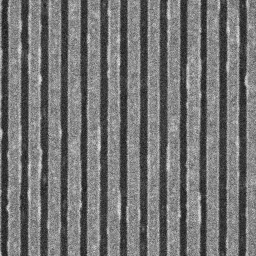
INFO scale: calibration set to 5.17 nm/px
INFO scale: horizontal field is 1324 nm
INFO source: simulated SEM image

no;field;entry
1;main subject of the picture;parallel lines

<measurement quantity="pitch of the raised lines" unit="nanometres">103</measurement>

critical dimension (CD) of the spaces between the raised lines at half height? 38.8 nm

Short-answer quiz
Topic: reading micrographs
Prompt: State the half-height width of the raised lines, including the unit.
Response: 0.0627 µm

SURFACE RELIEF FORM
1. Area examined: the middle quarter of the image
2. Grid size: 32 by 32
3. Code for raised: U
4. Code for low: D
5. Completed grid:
DUUUDDUUUDDUUUDDUUUDDUUUDDUUUDDU
DUUUDDUUUDDUUUDDUUUDDUUUDDUUUDDU
DUUUDDUUUDDUUUDDUUUDDUUUDDUUUDDU
DUUUDDUUUDDUUUDDUUUDDUUUDDUUUDDU
DUUUDDUUUDDUUUDDUUUDDUUUDDUUUDDU
DUUUDDUUUDDUUUDDUUUDDUUUDDUUUDDU
DUUUDDUUUDDUUUDDUUUDDUUUDDUUUDDU
DUUUDDUUUDDUUUDDUUUDDUUUDDUUUDDU
DUUUDDUUUDDUUUDDUUUDDUUUDDUUUDDU
DUUUDDUUUDDUUUDDUUUDDUUUDDUUUDDU
DUUUDDUUUDDUUUDDUUUDDUUUDDUUUDDU
DUUUDDUUUDDUUUDDUUUDDUUUDDUUUDDU
DUUUDDUUUDDUUUDDUUUDDUUUDDUUUDDU
DUUUDDUUUDDUUUDDUUUDDUUUDDUUUDDU
DUUUDDUUUDDUUUDDUUUDDUUUDDUUUDDU
DUUUDDUUUDDUUUDDUUUDDUUUDDUUUDDU
DUUUDDUUUDDUUUDDUUUDDUUUDDUUUDDU
DUUUDDUUUDDUUUDDUUUDDUUUDDUUUDDU
DUUUDDUUUDDUUUDDUUUDDUUUDDUUUDDU
DUUUDDUUUDDUUUDDUUUDDUUUDDUUUDDU
DUUUDDUUUDDUUUDDUUUDDUUUDDUUUDDU
DUUUDDUUUDDUUUDDUUUDDUUUDDUUUDDU
DUUUDDUUUDDUUUDDUUUDDUUUDDUUUDDU
DUUUDDUUUDDUUUDDUUUDDUUUDDUUUDDU
DUUUDDUUUDDUUUDDUUUDDUUUDDUUUDDU
DUUUDDUUUDDUUUDDUUUDDUUUDDUUUDDU
DUUUDDUUUDDUUUDDUUUDDUUUDDUUUDDU
DUUUDDUUUDDUUUDDUUUDDUUUDDUUUDDU
DUUUDDUUUDDUUUDDUUUDDUUUDDUUUDDU
DUUUDDUUUDDUUUDDUUUDDUUUDDUUUDDU
DUUUDDUUUDDUUUDDUUUDDUUUDDUUUDDU
DUUUDDUUUDDUUUDDUUUDDUUUDDUUUDDU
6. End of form